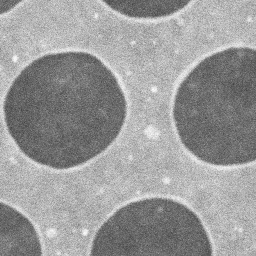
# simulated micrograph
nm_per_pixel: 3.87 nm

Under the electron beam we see holes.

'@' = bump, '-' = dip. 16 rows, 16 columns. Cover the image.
-@@@@@@-----@@@@
@@@@@@@@@@@@@@@@
@@@@@@@@@@@@@@@@
@@@---@@@@@@@---
@------@@@@@----
@-------@@@-----
--------@@@-----
--------@@@-----
@------@@@@-----
@-----@@@@@@----
@@@-@@@@@@@@@@@@
@@@@@@@@@@@@@@@@
@@@@@@@@@--@@@@@
--@@@@@-----@@@@
--@@@@-------@@@
---@@@-------@@@